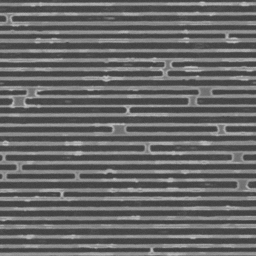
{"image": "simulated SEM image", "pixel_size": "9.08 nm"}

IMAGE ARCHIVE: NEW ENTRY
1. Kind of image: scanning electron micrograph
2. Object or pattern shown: parallel lines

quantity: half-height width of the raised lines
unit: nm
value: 31.8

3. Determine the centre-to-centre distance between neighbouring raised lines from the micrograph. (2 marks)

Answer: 84.1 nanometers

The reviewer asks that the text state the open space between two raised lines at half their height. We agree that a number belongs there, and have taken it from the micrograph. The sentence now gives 6.26 pixels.